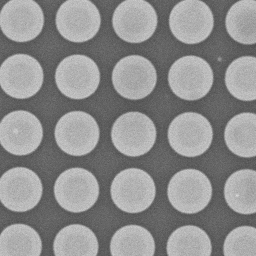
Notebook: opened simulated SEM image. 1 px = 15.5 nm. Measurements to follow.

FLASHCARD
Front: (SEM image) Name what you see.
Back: an array of small figures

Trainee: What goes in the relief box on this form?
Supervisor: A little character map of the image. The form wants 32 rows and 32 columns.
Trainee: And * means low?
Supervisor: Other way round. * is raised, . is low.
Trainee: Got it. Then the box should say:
.****...****...****...****...***
*****..*****..*****..*****...***
*****..*****..******.******.****
*****..*****..*****..******.****
.****...****...****...****...***
................................
................................
.***....***....***....***....***
*****..*****..*****..*****...***
*****..*****..*****..******.****
*****..*****..*****..*****..****
.****...****...****...****...***
................................
................................
.***....***....***....***.....**
*****..*****..*****..*****..****
*****..*****..*****..*****..****
*****..*****..*****..*****..****
.****...****...****...****...***
.......................*......**
................................
.***....***....***....***.....**
*****..*****..*****..*****..****
*****..*****..*****..*****..****
*****..*****..*****..*****..****
*****..*****..*****..*****...***
................*......**.....**
................................
.***....***....***.....**.....**
*****..*****..*****..*****..****
*****..*****..*****..*****..****
*****..*****..*****..*****..****